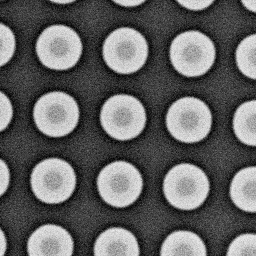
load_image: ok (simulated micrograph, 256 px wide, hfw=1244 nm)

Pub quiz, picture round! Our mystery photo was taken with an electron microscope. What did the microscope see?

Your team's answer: an array of small figures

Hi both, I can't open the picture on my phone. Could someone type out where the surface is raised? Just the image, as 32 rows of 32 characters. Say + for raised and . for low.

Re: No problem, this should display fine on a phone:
...............++......+++....++
................................
................................
+.....+++.......................
++...+++++....++++....++++.....+
++...+++++...+++++...++++++...++
++...+++++...+++++...++++++...++
+....+++++...+++++...++++++...++
......+++.....+++.....++++....++
...............................+
................................
................................
+....++++.....+++.....+++.......
+...++++++...+++++...+++++....++
+...++++++...+++++...+++++...+++
+....+++++...+++++...+++++...+++
.....++++....++++....+++++...+++
......................+++.....++
................................
................................
+....+++......++................
+...+++++....++++....++++.....++
+...+++++...++++++...+++++...+++
+...+++++...++++++...+++++...+++
.....++++....++++....+++++...+++
..............++.....++++....+++
................................
................................
.....+++........................
....+++++...+++++....++++.....++
+...+++++...+++++...+++++....+++
+...+++++...+++++...++++++..++++